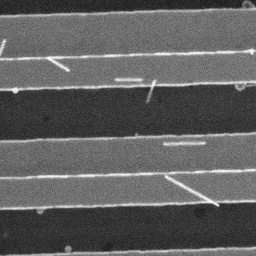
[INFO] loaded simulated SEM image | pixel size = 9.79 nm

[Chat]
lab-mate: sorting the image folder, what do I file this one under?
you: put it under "lines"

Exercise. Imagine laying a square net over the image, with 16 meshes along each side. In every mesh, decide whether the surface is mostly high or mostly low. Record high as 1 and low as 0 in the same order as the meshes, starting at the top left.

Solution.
0000000000000000
1111111111111111
1111111111111111
1111111111111111
1111111111111111
1111100000000000
0000000000000000
0000000000000000
0000000000001111
1111111111111111
1111111111111111
1111111111111111
1111111111111111
0000000000000000
0000000000000000
0000000000000000